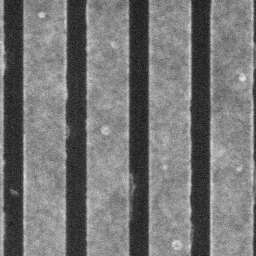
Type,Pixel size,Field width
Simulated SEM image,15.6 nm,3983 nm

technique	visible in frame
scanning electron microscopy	lines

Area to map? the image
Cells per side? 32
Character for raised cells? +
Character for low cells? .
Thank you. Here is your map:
...+++++...+++++...+++++...+++++
...+++++...+++++...+++++...+++++
...+++++...+++++...+++++..++++++
...+++++...+++++...+++++..++++++
...+++++...+++++...+++++..++++++
...+++++...+++++...+++++..++++++
...+++++...+++++...+++++..++++++
...+++++...+++++...+++++..++++++
...+++++...+++++...+++++..++++++
...+++++...+++++...+++++..++++++
...+++++...+++++...+++++..++++++
...+++++...+++++...+++++..+++++.
...+++++...+++++...+++++..++++++
...+++++...+++++...+++++..++++++
...+++++...+++++...+++++..++++++
...+++++...+++++...+++++..++++++
...+++++...+++++...+++++..++++++
...+++++...+++++...+++++..++++++
...+++++...+++++...+++++..++++++
...+++++...+++++...+++++..++++++
...+++++...+++++...+++++..++++++
...+++++...+++++...+++++..++++++
...+++++...+++++...+++++..++++++
...+++++...+++++...+++++..+++++.
...+++++...+++++...+++++..++++++
...+++++...+++++...+++++..++++++
...+++++...+++++...+++++..++++++
...+++++...+++++...+++++..++++++
...+++++...+++++...+++++..++++++
...+++++...+++++...+++++..++++++
...+++++...+++++...+++++..+++++.
...+++++...+++++...+++++..++++++